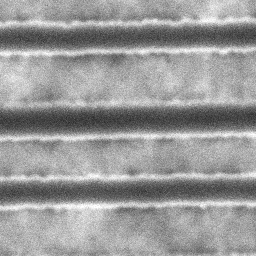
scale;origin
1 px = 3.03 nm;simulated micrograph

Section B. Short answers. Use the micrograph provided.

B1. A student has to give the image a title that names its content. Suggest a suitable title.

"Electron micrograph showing lines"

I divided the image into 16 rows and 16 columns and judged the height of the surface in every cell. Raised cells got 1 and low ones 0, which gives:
0000000000000000
1111111111111111
1111111111111111
0000000000000000
0000000000000000
0000000000000000
0011111111111111
1111111111111111
1111111111111000
0000000000000000
0000000000000000
1111111111111111
1111111111111111
0000000000000000
0000000000000000
0000000000000000